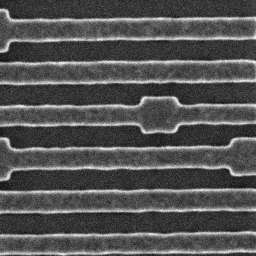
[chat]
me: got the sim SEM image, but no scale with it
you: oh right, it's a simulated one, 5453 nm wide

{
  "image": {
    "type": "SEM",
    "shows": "wiring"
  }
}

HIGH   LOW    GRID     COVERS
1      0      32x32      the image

00000000000000000000000000000000
10000000000000000000000000000000
11111111111111111111111111111111
11111111111111111111111111111111
11111111111111111111111111111111
10000000000000000000000000000000
00000000000000000000000000000000
00000000000000000000000000000000
11111111111111111111111111111111
11111111111111111111111111111111
00100000000000000000000000000000
00000000000000000000000000000000
00000000000000000011110000000000
11111111111111111111111111111111
11111111111111111111111111111111
11111111111111111111111110111110
00000000000000000011110000000000
10000000000000000000000000000111
11000000111110111011111111111111
11111111111111111111111111111111
11111111111111111111111111111111
11000000000000000000000000000111
10000000000000000000000000000000
00000000000000000000000000000000
11111111111111111111111111111111
11111111111111111111111111111111
11111110000000000000000000000000
00000000000000000000000000000000
00000000000000000000000000000000
11111111111111111111111111111111
11111111111111111111111111111111
11111111111111111111111111111101